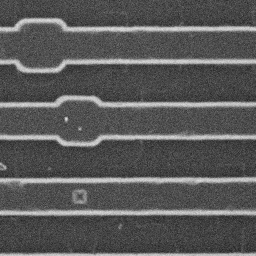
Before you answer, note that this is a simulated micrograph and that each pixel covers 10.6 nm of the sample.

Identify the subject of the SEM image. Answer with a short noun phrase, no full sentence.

wiring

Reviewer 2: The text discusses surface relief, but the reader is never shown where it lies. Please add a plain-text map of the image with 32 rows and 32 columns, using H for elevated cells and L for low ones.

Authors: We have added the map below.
LLLLLLLLLLLLLLLLLLLLLLLLLLLLLLLL
LLLLLLLLLLLLLLLLLLLLLLLLLLLLLLLL
LLLLLLLLLLLLLLLLLLLLLLLLLLLLLLLL
LLHHHHHHLLLLLLLLLLLLLLLLLLLLLLLL
HHHHHHHHHHHHHHHHHHHHHHHHHHHHHHHH
HHHHHHHHHHHHHHHHHHHHHHHHHHHHHHHH
HHHHHHHHHHHHHHHHHHHHHHHHHHHHHHHH
HHHHHHHHHHHHHHHHHHHHHHHHHHHHHHHH
LLLHHHHHLLLLLLLLLLLLLLLLLLLLLLLL
LLLLLLLLLLLLLLLLLLLLLLLLLLLLLLLL
LLLLLLLLLLLLLLLLLLLLLLLLLLLLLLLL
LLLLLLLLLLLLLLLLLLLLLLLLLLLLLLLL
LLLLLLLLHHHHLLLLLLLLLLLLLLLLLLLL
HHHHHHHHHHHHHHHHHHHHHHHHHHHHHHHH
HHHHHHHHHHHHHHHHHHHHHHHHHHHHHHHH
HHHHHHHHHHHHHHHHHHHHHHHHHHHHHHHH
HHHHHHHHHHHHHHHHHHHHHHHHHHHHHHHH
LLLLLLLHHHHHLLLLLLLLLLLLLLLLLLLL
LLLLLLLLLLLLLLLLLLLLLLLLLLLLLLLL
LLLLLLLLLLLLLLLLLLLLLLLLLLLLLLLL
LLLLLLLLLLLLLLLLLLLLLLLLLLLLLLLL
LLLLLLLLLLLLLLLLLLLLLLLLLLLLLLLL
LLLLLLLLLLLLLLLLHHHHHHHHHHHLHHHH
HHHHHHHHHHHHHHHHHHHHHHHHHHHHHHHH
HHHHHHHHHHHHHHHHHHHHHHHHHHHHHHHH
HHHHHHHHHHHHHHHHHHHHHHHHHHHHHHHH
HHHHHHHHHHHHHHHHHHHHHHHHHHHHHHHH
LLLLLLLLLLLLLLLLLLLLLLLLLLLLLLLL
LLLLLLLLLLLLLLLLLLLLLLLLLLLLLLLL
LLLLLLLLLLLLLLLLLLLLLLLLLLLLLLLL
LLLLLLLLLLLLLLLLLLLLLLLLLLLLLLLL
LLLLLLLLLLLLLLLLLLLLLLLLLLLLLLLL